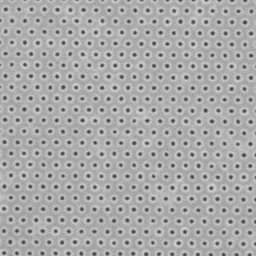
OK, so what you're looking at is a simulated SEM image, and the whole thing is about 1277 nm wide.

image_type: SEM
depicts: a regular array of holes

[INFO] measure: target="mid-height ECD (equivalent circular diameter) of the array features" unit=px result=4.37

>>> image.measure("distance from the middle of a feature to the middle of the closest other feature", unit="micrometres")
0.0624